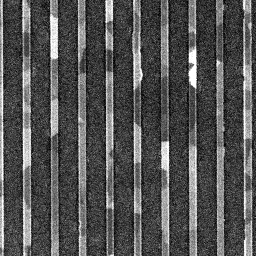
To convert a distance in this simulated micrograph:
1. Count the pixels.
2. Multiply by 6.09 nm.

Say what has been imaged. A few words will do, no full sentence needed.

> parallel lines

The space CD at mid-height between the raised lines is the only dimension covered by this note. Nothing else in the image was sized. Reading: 124 nanometres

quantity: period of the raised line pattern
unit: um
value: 0.168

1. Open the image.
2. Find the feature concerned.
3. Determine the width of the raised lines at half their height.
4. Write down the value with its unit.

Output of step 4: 44.9 nm